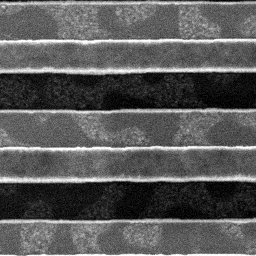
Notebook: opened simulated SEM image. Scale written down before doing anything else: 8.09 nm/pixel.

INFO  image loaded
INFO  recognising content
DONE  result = lines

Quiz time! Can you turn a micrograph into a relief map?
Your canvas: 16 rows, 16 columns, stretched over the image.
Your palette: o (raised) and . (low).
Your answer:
oooooooooooooooo
oooooooooooooooo
oooooooooooooooo
oooooooooooooooo
................
................
................
oooooooooooooooo
oooooooooooooooo
oooooooooooooooo
oooooooooooooooo
................
................
................
oooooooooooooooo
oooooooooooooooo